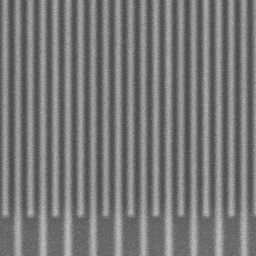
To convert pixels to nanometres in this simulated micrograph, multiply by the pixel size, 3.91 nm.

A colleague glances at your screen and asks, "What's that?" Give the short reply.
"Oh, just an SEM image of parallel lines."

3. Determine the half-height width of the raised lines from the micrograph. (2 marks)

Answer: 18.6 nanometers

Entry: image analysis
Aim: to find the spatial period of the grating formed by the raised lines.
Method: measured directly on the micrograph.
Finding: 49.1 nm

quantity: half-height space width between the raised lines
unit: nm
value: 29.3